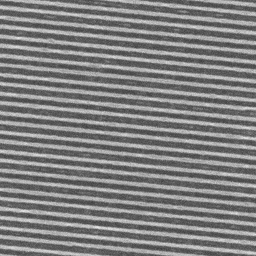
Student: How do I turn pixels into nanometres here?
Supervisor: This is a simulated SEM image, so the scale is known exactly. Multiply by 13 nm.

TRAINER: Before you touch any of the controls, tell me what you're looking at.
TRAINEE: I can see parallel lines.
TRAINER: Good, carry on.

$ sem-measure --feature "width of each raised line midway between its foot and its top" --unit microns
0.0372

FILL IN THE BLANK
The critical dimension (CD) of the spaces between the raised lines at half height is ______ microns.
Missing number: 0.0857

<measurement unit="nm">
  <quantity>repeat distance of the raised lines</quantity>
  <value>124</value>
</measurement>